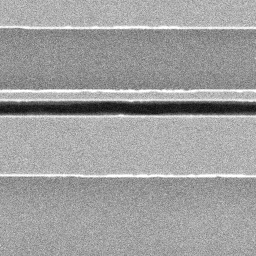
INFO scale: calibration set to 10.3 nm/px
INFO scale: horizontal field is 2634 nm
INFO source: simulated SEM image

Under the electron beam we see lines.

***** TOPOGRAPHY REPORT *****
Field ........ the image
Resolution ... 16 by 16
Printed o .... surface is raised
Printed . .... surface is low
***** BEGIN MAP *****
oooooooooooooooo
oooooooooooooooo
................
................
................
................
................
oooooooooooooooo
oooooooooooooooo
oooooooooooooooo
oooooooooooooooo
................
................
................
................
................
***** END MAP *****